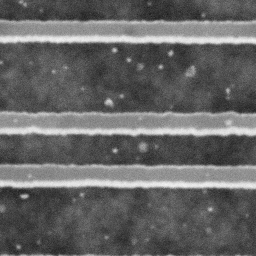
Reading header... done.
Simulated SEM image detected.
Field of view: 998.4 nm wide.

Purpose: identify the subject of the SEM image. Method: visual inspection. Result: lines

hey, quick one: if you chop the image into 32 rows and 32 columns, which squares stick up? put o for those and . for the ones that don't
................................
................................
................................
oooooooooooooooooooooooooooooooo
oooooooooooooooooooooooooooooooo
................................
................................
................................
................................
................................
................................
................................
................................
................................
oooooooooooooooooooooooooooooooo
oooooooooooooooooooooooooooooooo
.....oooo..ooo.oo.ooooo.oo.oo.oo
................................
................................
................................
................................
oooooooooooooooooooooooooooooooo
oooooooooooooooooooooooooooooooo
................................
................................
................................
................................
................................
................................
................................
................................
................................